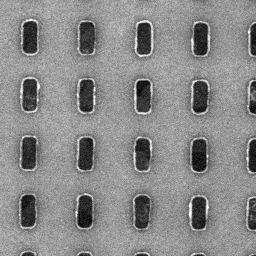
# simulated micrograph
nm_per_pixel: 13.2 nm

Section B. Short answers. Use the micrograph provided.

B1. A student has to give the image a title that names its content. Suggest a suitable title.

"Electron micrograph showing a regular array of raised bodies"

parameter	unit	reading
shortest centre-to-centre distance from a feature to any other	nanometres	752